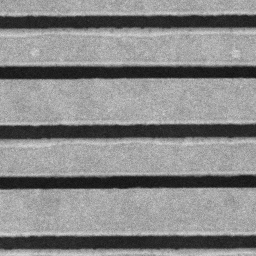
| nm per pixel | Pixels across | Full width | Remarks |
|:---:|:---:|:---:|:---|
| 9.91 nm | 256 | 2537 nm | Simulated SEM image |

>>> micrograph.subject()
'lines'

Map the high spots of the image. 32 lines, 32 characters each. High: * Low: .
********************************
********************************
................................
................................
********************************
********************************
********************************
********************************
................................
................................
********************************
********************************
********************************
********************************
********************************
*******.*.*....*................
................................
..............................**
********************************
********************************
********************************
********************************
................................
................................
********************************
********************************
********************************
********************************
********************************
................................
................................
...............*****.........***